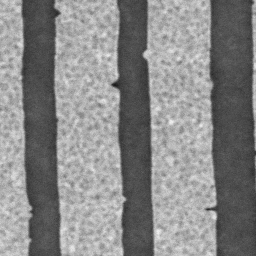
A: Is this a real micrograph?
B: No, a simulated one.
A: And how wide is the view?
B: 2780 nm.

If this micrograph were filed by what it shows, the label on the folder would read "one or a few lines or trenches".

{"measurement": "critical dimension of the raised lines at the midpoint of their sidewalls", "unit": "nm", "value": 657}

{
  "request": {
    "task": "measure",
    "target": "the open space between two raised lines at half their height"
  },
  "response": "0.369 µm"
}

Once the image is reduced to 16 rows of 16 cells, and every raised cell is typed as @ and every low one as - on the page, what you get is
@---@@@--@@@@---
@---@@@--@@@@---
@---@@@--@@@@---
@---@@@--@@@@---
@--@@@@--@@@@---
@--@@@@--@@@@---
@---@@@--@@@@---
@---@@@---@@@---
@---@@@---@@@---
@---@@@---@@@---
@---@@@---@@@---
@@--@@@@--@@@---
@@--@@@@--@@@---
@@--@@@@--@@@---
@@--@@@@--@@@---
@@--@@@@--@@@---